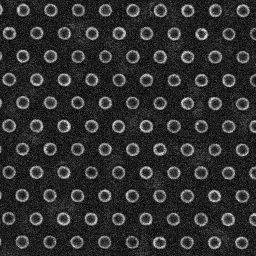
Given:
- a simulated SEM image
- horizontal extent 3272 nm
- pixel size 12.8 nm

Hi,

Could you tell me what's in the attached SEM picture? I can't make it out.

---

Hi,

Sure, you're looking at a regular array of raised bodies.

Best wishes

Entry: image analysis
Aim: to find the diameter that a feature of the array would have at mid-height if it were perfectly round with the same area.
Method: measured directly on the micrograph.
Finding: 153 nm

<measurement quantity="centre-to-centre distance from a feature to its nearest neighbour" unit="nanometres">341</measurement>